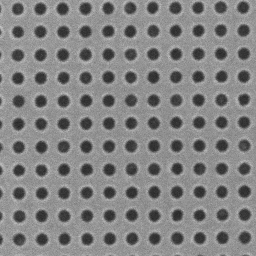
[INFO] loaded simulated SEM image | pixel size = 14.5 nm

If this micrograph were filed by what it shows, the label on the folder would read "a regular array of holes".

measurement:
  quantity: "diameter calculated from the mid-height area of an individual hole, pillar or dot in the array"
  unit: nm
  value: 195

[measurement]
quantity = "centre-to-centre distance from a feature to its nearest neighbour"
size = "323 nanometres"